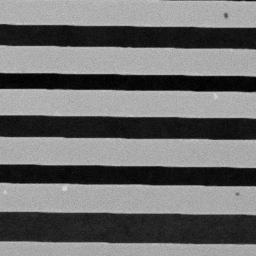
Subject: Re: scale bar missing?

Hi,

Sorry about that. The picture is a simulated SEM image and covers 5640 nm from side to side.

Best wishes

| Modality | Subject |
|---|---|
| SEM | lines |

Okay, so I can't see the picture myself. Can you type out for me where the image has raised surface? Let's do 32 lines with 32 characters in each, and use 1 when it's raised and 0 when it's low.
11111111111111111111111111111111
11111111111111111111111111111111
11111111111111111111111111111111
00000000000000000000000000000000
00000000000000000000000000000000
00000000000000000000000000000000
11111111111111111111111111111111
11111111111111111111111111111111
11111111111111111111111111111111
00000000000000000000000000000011
00000000000000000000000000000000
11111111111111111111111110000000
11111111111111111111111111111111
11111111111111111111111111111111
00000000000001111111111111111111
00000000000000000000000000000000
00000000000000000000000000000000
11111111111111111111111111100000
11111111111111111111111111111111
11111111111111111111111111111111
00001111111111111111111111111111
00000000000000000000000000000000
00000000000000000000000000000000
11111111111111111111111111111111
11111111111111111111111111111111
11111111111111111111111111111111
00000111111111111111111111111111
00000000000000000000000000000000
00000000000000000000000000000000
00000000000000000000000000000000
11111111111111111111111100000000
11111111111111111111111111111111